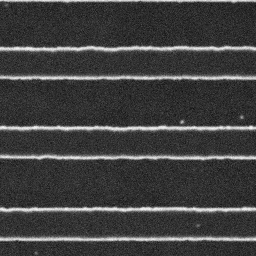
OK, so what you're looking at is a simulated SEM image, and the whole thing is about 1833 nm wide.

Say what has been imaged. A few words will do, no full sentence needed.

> lines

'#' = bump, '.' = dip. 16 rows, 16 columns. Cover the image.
................
................
................
################
################
................
................
................
################
################
................
................
................
################
################
................